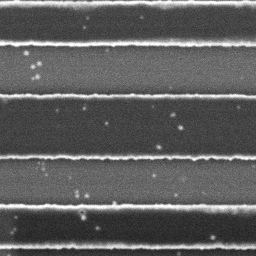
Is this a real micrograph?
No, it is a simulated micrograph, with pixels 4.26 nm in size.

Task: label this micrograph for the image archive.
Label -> lines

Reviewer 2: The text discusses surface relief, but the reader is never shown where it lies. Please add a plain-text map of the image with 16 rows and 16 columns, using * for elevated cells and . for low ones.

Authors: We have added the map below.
****************
****************
****************
................
................
................
****************
****************
****************
****************
................
................
................
****************
****************
.........****..*